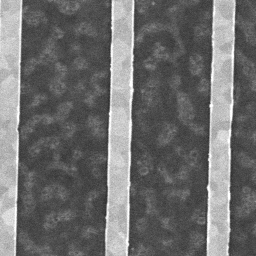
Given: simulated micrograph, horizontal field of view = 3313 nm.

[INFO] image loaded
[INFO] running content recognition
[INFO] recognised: one or a few lines or trenches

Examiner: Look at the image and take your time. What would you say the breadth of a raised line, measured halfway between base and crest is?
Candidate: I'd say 21.1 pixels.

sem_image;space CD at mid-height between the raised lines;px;84.9